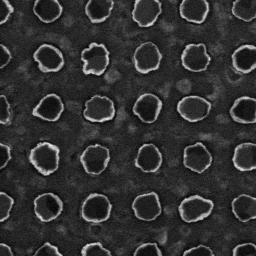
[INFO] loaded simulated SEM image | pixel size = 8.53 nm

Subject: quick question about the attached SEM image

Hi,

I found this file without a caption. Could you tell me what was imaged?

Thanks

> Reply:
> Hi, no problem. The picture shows a regular array of raised bodies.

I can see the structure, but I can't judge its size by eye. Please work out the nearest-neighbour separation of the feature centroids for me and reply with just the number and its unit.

412 nm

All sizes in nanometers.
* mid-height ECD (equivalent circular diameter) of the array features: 237